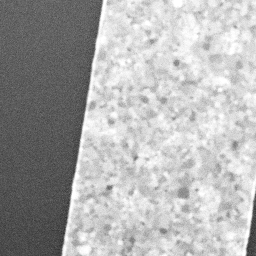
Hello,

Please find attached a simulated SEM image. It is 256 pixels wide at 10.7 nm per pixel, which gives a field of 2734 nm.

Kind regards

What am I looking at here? one or a few lines or trenches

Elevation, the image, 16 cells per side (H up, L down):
LLLLLLHHHHHHHHHH
LLLLLLHHHHHHHHHH
LLLLLLHHHHHHHHHH
LLLLLLHHHHHHHHHH
LLLLLLHHHHHHHHHH
LLLLLLHHHHHHHHHH
LLLLLHHHHHHHHHHH
LLLLLHHHHHHHHHHH
LLLLLHHHHHHHHHHH
LLLLLHHHHHHHHHHH
LLLLLHHHHHHHHHHH
LLLLLHHHHHHHHHHH
LLLLLHHHHHHHHHHH
LLLLHHHHHHHHHHHH
LLLLHHHHHHHHHHHH
LLLLHHHHHHHHHHHL